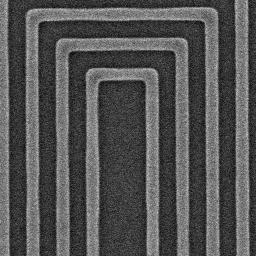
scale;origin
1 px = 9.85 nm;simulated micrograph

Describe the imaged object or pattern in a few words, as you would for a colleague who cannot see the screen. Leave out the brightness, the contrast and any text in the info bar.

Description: groups of lines, slits or small figures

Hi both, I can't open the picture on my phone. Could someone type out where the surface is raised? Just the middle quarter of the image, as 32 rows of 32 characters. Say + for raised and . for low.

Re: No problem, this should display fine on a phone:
+...........................+++.
+.....+++++++++++++++++.....+++.
+.....+++++++++++++++++.....+++.
+.....+++++++++++++++++.....+++.
+.....+++...........+++.....+++.
+.....++.............++.....+++.
+.....++.............++.....+++.
+.....++.............++.....+++.
+.....++.............++.....+++.
+.....++.............++.....+++.
+.....++.............++.....+++.
+.....++.............++.....+++.
+.....++.............++.....+++.
+.....++.............++.....+++.
+.....++.............++.....+++.
+.....++.............++.....+++.
+.....++.............++.....+++.
+.....++.............++.....+++.
+.....++.............++.....+++.
+.....++.............++.....+++.
+.....++.............++.....+++.
+.....++.............++.....+++.
+.....+++............++.....+++.
+.....+++............++.....+++.
+.....+++............++.....+++.
+.....+++............++.....+++.
+.....+++............++.....+++.
+.....+++............++.....+++.
+.....+++............++.....+++.
+.....+++............++.....+++.
+.....+++............++.....+++.
+.....+++............++.....+++.